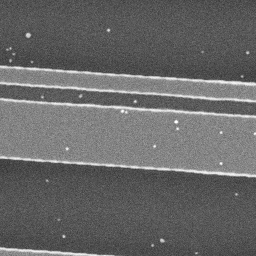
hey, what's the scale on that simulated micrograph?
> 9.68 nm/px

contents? lines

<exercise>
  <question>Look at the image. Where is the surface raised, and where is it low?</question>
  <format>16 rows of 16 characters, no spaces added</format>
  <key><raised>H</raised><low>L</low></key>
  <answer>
LLLLLLLLLLLLLLLL
LLLLLLLLLLLLLLLL
LLLLLLLLLLLLLLLL
LLLLLLLLLLLLLLLL
HHHHHLLLLLLLLLLL
HHHHHHHHHHHHHHHH
HHHHHHHHHHHHHHHH
HHHHHHHHHHHHHHHH
HHHHHHHHHHHHHHHH
HHHHHHHHHHHHHHHH
LLLLLLLLLHHHHHHH
LLLLLLLLLLLLLLLL
LLLLLLLLLLLLLLLL
LLLLLLLLLLLLLLLL
LLLLLLLLLLLLLLLL
LLLLLLLLLLLLLLLL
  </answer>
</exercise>